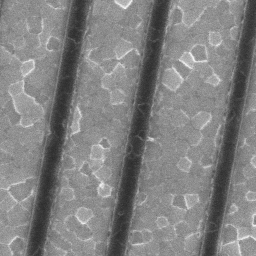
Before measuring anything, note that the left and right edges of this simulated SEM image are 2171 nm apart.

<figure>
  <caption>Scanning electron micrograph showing one or a few lines or trenches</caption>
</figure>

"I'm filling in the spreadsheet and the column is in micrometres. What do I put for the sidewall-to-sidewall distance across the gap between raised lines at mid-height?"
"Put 0.572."